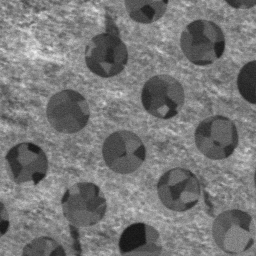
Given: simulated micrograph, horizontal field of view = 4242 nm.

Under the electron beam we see a regular array of raised bodies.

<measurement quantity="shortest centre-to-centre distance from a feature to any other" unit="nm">1110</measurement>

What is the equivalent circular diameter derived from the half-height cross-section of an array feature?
44.9 px